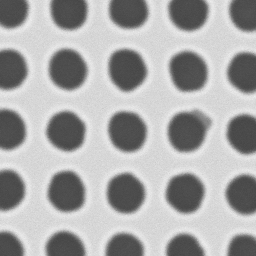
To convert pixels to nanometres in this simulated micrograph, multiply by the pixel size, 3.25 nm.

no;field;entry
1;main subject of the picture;a regular array of holes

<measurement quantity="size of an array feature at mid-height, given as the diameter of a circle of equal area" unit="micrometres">0.131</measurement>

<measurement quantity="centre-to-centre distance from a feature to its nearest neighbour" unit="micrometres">0.192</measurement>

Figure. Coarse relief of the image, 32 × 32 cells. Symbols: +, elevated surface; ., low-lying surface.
....++.....+++....+++.....+++...
....++.....+++.....++.....+++...
...++++....+++....+++.....+++...
+.++++++..+++++..+++++...+++++..
++++++++++++++++++++++++++++++++
++++++++++++++++++++++++++++++++
..+++++...++++...++++++.++++++.+
...+++....++++....+++....++++...
...+++.....+++....+++.....++....
...+++.....+++....+++.....++....
...++++...++++....++++....+++...
++++++++++++++++++++++++++++++..
++++++++++++++++++++++++++++++++
++++++++++++++++++++++++++++++++
..+++++...++++...+++++....++++..
...+++.....+++....+++......+....
...+++.....+++....+++.....++....
...+++.....+++....+++.....++....
..+++++...+++++...++++...++++...
++++++++++++++++++++++++++++++++
++++++++++++++++++++++++++++++++
..+++++..+++++++++++++++++++++++
...+++....++++...++++....++++...
...+++.....++.....+++.....++....
...+++.....++.....+++....+++....
..++++....++++....+++....++++...
++++++++.++++++..+++++..++++++..
++++++++++++++++++++++++++++++++
++++++++++++++++++++++++++++++++
..++++....++++...+++++..+++++...
...+++....+++.....+++....++++...
...+++.....++.....+++....+++....